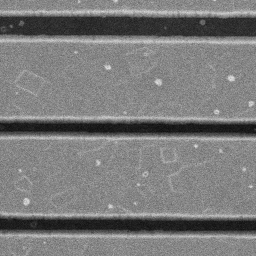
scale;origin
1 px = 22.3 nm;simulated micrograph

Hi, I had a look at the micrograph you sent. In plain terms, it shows lines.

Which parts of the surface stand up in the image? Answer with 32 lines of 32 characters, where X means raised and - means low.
XXXXXXXXXXXXXXXXXXXXXXXXXXXXXXXX
XXXXXXXXXXXXXXXXXXXXXXXXXXXXXXXX
--------------------------------
--------------------------------
--------------------------------
XXXXXXXXXXXXXXXXXXXXXXXXXXXXXXXX
XXXXXXXXXXXXXXXXXXXXXXXXXXXXXXXX
XXXXXXXXXXXXXXXXXXXXXXXXXXXXXXXX
XXXXXXXXXXXXXXXXXXXXXXXXXXXXXXXX
XXXXXXXXXXXXXXXXXXXXXXXXXXXXXXXX
XXXXXXXXXXXXXXXXXXXXXXXXXXXXXXXX
XXXXXXXXXXXXXXXXXXXXXXXXXXXXXXXX
XXXXXXXXXXXXXXXXXXXXXXXXXXXXXXXX
XXXXXXXXXXXXXXXXXXXXXXXXXXXXXXXX
XXXXXXXXXXXXXXXXXXXXXXXXXXXXXXXX
--------------------------------
--------------------------------
XXXXXXXXXXXXXXXXXXXXXXXXXXXXXXXX
XXXXXXXXXXXXXXXXXXXXXXXXXXXXXXXX
XXXXXXXXXXXXXXXXXXXXXXXXXXXXXXXX
XXXXXXXXXXXXXXXXXXXXXXXXXXXXXXXX
XXXXXXXXXXXXXXXXXXXXXXXXXXXXXXXX
XXXXXXXXXXXXXXXXXXXXXXXXXXXXXXXX
XXXXXXXXXXXXXXXXXXXXXXXXXXXXXXXX
XXXXXXXXXXXXXXXXXXXXXXXXXXXXXXXX
XXXXXXXXXXXXXXXXXXXXXXXXXXXXXXXX
XXXXXXXXXXXXXXXXXXXXXXXXXXXXXXXX
--------------------------------
--------------------------------
XXXXXXXXXXXXXXXXXXXXXXXXXXXXXXXX
XXXXXXXXXXXXXXXXXXXXXXXXXXXXXXXX
XXXXXXXXXXXXXXXXXXXXXXXXXXXXXXXX